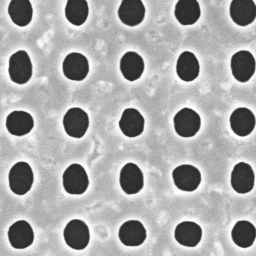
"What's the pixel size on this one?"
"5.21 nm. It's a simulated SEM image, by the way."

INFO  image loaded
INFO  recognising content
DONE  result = a regular array of holes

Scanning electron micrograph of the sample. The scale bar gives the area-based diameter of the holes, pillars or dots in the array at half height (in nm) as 145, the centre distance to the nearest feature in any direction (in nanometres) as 288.